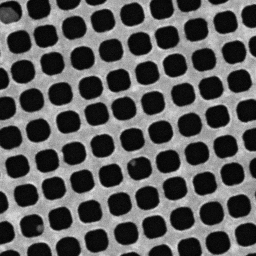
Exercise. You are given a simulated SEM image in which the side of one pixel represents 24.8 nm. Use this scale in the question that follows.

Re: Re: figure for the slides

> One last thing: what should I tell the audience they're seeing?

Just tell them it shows a regular array of holes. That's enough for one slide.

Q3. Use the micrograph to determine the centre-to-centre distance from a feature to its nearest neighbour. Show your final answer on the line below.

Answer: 29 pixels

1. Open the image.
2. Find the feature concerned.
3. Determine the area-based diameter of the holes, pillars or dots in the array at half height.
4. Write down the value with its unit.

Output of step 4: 0.62 micrometres